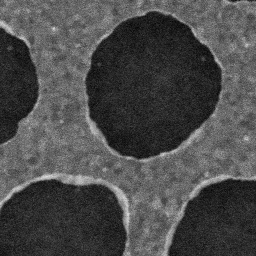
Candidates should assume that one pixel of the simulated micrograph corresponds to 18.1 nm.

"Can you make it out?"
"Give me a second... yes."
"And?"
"holes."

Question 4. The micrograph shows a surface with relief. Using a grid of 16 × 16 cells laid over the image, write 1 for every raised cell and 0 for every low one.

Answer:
1111111111111111
1111111000001111
0111110000001111
0011110000000111
0011100000000011
0011100000000011
0011100000000011
0111110000000111
0111110000001111
1111111000111111
1111111111111111
1100000111111000
0000000011110000
0000000011100000
0000000011100000
0000000011000000